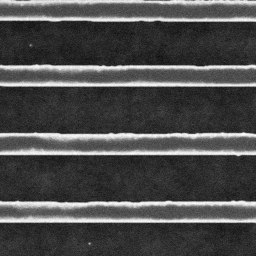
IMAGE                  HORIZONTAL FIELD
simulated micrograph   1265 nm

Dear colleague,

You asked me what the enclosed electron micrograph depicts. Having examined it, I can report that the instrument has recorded lines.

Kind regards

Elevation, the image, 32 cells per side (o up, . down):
oooooooooooooooooooooooooooooooo
oooooooooooooooooooooooooooooooo
oooooooooooooooooooooooooooooooo
................................
................................
................................
................................
................................
oooooooooooooooooooooooooooooooo
oooooooooooooooooooooooooooooooo
oooooooooooooooooooooooooooooooo
................................
................................
................................
................................
................................
................................
oooooooooooooooooooooooooooooooo
oooooooooooooooooooooooooooooooo
................................
................................
................................
................................
................................
................................
oooooooooooooooooooooooooooooooo
oooooooooooooooooooooooooooooooo
oooooooooooooooooooooooooooooooo
................................
................................
................................
................................